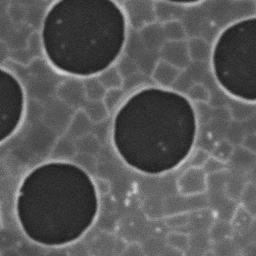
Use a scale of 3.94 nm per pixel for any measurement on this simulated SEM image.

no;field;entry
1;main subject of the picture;holes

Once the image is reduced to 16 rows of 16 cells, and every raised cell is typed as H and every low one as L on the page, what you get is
HHHLLLLHHHHHHHHH
HHHLLLLLHHHHHHHL
HHHLLLLLHHHHHHLL
HHHLLLLHHHHHHLLL
HHHHLLHHHHHHHLLL
LHHHHHHHHHHHHHLL
LHHHHHHHLLLLHHHH
LHHHHHHLLLLLHHHH
LHHHHHHLLLLLHHHH
HHHHHHHLLLLLHHHH
HHLLLHHHLLLHHHHH
HLLLLLHHHHHHHHHH
HLLLLLHHHHHHHHHH
HLLLLLHHHHHHHHHH
HHLLLHHHHHHHHHHH
HHHHHHHHHHHHHHHH